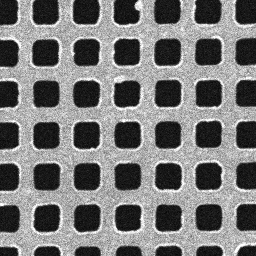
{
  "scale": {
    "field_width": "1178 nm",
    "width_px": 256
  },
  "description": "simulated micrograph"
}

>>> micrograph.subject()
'a regular array of holes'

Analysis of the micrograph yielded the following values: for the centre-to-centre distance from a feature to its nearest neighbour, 186 nanometers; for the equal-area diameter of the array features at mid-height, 132 nanometers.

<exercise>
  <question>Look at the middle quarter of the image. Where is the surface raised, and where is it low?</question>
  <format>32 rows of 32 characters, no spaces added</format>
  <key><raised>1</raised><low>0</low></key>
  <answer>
11110000111111000111111111111111
11111111111111111111111111111111
11111111111111111111111111111111
11111111111111111111111111111111
11100000111111000011111000000111
11100000011110000001111000000111
11000000011110000001111000000111
11000000011100000001111000000111
11000000011100000001111000000111
11100000011100000001111000000111
11100000111110000011111000001111
11111111111111111111111111111111
11111111111111111111111111111111
11111111111111111111111111111111
11111001111111000011111100001111
11100000011110000001111000000111
11000000011110000001111000000111
11000000011100000001111000000111
11000000011100000001111000000111
11000000011110000001111000000111
11100000011110000001111000000111
11111111111111111111111111111111
11111111111111111111111111111111
11111111111111111111111111111111
11111111111111111111111111111111
11100000011110000001111000000111
11000000011110000001111000000011
11000000011110000001111000000011
11000000011110000001111000000111
11000000011110000001111000000111
11100000011110000001111000000111
11110000111111000011111111111111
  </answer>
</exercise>